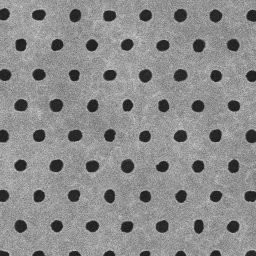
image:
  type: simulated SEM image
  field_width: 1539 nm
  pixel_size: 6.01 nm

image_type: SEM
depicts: a regular array of holes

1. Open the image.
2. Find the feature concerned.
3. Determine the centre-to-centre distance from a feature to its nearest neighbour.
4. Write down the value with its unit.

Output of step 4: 34.4 pixels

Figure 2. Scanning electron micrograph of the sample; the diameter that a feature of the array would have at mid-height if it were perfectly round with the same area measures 72.6 nm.